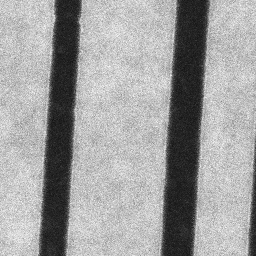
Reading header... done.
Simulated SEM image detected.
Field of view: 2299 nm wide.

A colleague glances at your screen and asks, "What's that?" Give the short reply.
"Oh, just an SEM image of one or a few lines or trenches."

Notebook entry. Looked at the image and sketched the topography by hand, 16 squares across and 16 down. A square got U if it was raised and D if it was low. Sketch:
DDDUUDDDDDDUUDDD
DDDUUDDDDDDUUDDD
DDDUUDDDDDDUUDDD
DDDUUDDDDDDUUDDD
DDDUUDDDDDDUUDDD
DDDUUDDDDDDUUDDD
DDDUUDDDDDDUUDDD
DDDUUDDDDDUUUDDD
DDDUUDDDDDUUUDDD
DDDUUDDDDDUUUDDD
DDDUUDDDDDUUUDDD
DDDUDDDDDDUUDDDD
DDDUDDDDDDUUDDDD
DDUUDDDDDDUUDDDD
DDUUDDDDDDUUDDDU
DDUUDDDDDDUUDDDU